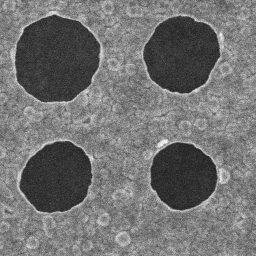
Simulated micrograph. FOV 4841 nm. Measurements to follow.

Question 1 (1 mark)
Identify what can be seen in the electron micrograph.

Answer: holes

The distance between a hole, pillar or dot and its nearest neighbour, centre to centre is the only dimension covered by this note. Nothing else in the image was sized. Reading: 2270 nm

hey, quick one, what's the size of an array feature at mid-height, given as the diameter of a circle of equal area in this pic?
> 1390 nm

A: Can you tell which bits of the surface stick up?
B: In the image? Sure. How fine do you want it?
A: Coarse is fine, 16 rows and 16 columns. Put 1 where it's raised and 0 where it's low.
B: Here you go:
1111111111111111
1100011111000111
1000001110000011
1000001110000011
1000001110000111
1000011111001111
1111111111111111
1111111111111111
1111111111111111
1100011111000111
1000001110000111
1000001110000011
1100011111000111
1111111111111111
1111111111111111
1111111111111111